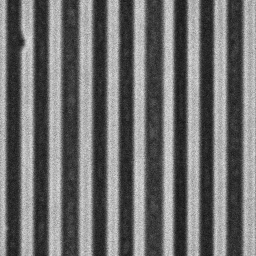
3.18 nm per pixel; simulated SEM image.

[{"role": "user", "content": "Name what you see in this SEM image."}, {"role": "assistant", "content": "parallel lines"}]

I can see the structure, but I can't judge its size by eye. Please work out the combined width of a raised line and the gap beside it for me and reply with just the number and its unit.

87.5 nm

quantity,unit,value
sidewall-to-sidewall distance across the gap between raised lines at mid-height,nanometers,42.5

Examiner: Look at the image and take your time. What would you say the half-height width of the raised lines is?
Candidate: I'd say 45.3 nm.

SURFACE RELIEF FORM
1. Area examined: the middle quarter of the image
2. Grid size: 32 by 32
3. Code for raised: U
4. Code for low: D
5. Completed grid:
DDDDUUUDDDDUUUDDDUUUDDDDDUUUDDDU
DDDDUUUDDDDUUUDDDUUUDDDDDUUUDDDU
DDDDUUUDDDDUUUDDDUUUDDDDDUUUDDDU
DDDDUUUDDDDUUUDDDUUUDDDDDUUUDDDU
DDDDUUUDDDDUUUDDDUUUDDDDDUUUDDDU
DDDDUUUDDDDUUUDDDUUUDDDDDUUUDDDU
DDDDUUUDDDDUUUDDDUUUDDDDDUUUDDDU
DDDDUUUDDDDUUUDDDUUUDDDDDUUUDDDU
DDDDUUUDDDDUUUDDDUUUDDDDDUUUDDDU
DDDDUUUDDDDUUUDDDUUUDDDDDUUUDDDU
DDDDUUUDDDDUUUDDDUUUDDDDDUUUDDDU
DDDDUUUDDDDUUUDDDUUUDDDDDUUUDDDU
DDDDUUUDDDDUUUDDDUUUDDDDDUUUDDDU
DDDDUUUDDDDUUUDDDUUUDDDDDUUUDDDU
DDDDUUUDDDDUUUDDDUUUDDDDDUUUDDDU
DDDDUUUDDDDUUUDDDUUUDDDDDUUUDDDU
DDDDUUUDDDDUUUDDDUUUDDDDDUUUDDDU
DDDDUUUDDDDUUUDDDUUUDDDDDUUUDDDU
DDDDUUUDDDDUUUDDDUUUDDDDDUUUDDDU
DDDDUUUDDDDUUUDDDUUUDDDDDUUUDDDU
DDDDUUUDDDDUUUDDDUUUDDDDDUUUDDDU
DDDDUUUDDDDUUUDDDUUUDDDDDUUUDDDU
DDDDUUUDDDDUUUDDDUUUDDDDDUUUDDDU
DDDDUUUDDDDUUUDDDUUUDDDDDUUUDDDU
DDDDUUUDDDDUUUDDDUUUDDDDDUUUDDDU
DDDDUUUDDDDUUUDDDUUUDDDDDUUUDDDU
DDDDUUUDDDDUUUDDDUUUDDDDDUUUDDDU
DDDDUUUDDDDUUUDDDUUUDDDDDUUUDDDU
DDDDUUUDDDDUUUDDDUUUDDDDDUUUDDDU
DDDDUUUDDDDUUUDDDUUUDDDDDUUUDDDU
DDDDUUUDDDDUUUDDDUUUDDDDDUUUDDDU
DDDDUUUDDDDUUUDDDUUUDDDDDUUUDDDU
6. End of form